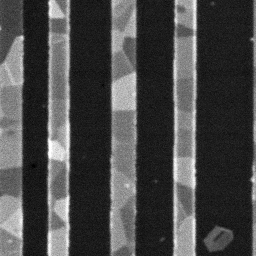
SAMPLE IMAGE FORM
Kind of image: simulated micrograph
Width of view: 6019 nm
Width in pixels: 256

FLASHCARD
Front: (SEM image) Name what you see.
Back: lines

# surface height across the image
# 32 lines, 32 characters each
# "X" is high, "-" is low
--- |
XXX---XXX-----XXX-----XX--------
XXX---XXX-----XXX-----XX--------
XXX---XXX-----XXX-----XX--------
XXX---XXX-----XXX-----XX--------
XXX---XXX-----XXX-----XX--------
XXX---XXX-----XXX-----XX--------
XXX---XXX-----XXX-----XX--------
XXX---XX------XXX-----XX--------
XXX---XX------XXX-----XX--------
XXX---XX------XXX-----XX--------
XXX---XX------XXX-----XX--------
XXX---XX------XXX-----XX--------
XXX---XXX-----XXX-----XX--------
XXX---XXX-----XXX-----XX--------
XXX---XX------XXX-----XX--------
XXX---XX------XXX-----XX--------
XXX---XXX-----XXX-----XX--------
XXX---XXX-----XXX-----XX--------
XXX---XX------XXX-----XX--------
XXX---XXX-----XXX-----XX--------
XXX---XX------XXX-----XX--------
XXX---XXX-----XXX-----XX--------
XXX---XX------XXX-----XX--------
XXX---XX------XXX-----XX--------
XXX---XX------XXX-----XX--------
XXX---XX------XXX-----XX--------
XXX---XX------XXX-----XX--------
XXX---XXX-----XXX-----XX--------
XXX---XXX-----XXX-----XX--------
XXX---XX------XXX-----XX--XXX---
XXX---XX------XXX-----XX--XX----
XXX---XX------XXX-----XX--------